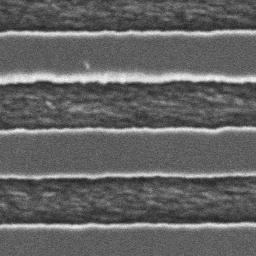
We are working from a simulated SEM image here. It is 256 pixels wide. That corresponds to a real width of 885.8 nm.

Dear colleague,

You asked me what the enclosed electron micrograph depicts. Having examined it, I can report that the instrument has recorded lines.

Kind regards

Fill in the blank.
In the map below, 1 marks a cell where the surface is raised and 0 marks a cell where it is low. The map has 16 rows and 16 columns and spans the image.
0000000000000000
0000000000000000
1111111111111111
1111111111111111
1111111111111111
0000000000000000
0000000000000000
0000000000000000
1111111111111111
1111111111111111
1111111111111111
0000000000000000
0000000000000000
0000000000000000
1111111111111111
1111111111111111